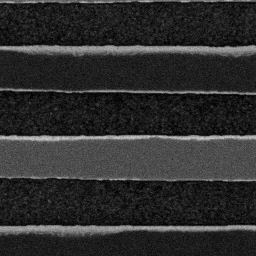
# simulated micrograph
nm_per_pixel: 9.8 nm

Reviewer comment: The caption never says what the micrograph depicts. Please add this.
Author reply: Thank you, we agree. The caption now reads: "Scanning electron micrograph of lines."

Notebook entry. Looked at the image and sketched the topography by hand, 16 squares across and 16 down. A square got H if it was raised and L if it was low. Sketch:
LLLLLLLLLLLLLLLL
LLLLLLLLLLLLLLLL
LLLLLLLLLLLLLLLL
HHHHHHHHHHHHHHHH
HHHHHHHHHHHHHHHH
HHHHHHHHHHHHHHHH
LLLLLLLLLLLLLLLL
LLLLLLLLLLLLLLLL
LLLLLLLLLLLLLLLL
HHHHHHHHHHHHHHHH
HHHHHHHHHHHHHHHH
LLLLLLLLLLLLLLLL
LLLLLLLLLLLLLLLL
LLLLLLLLLLLLLLLL
HHHHHHHHHHHHHHHH
HHHHHHHHHHHHHHHH